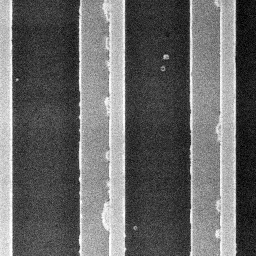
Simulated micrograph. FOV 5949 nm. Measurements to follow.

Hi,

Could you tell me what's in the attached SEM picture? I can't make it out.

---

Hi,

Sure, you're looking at lines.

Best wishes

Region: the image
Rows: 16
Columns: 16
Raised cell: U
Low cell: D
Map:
UDDDDUUUDDDDUUUD
UDDDDUUUDDDDUUUD
UDDDDUUUDDDDUUUD
UDDDDUUUDDDDUUUD
UDDDDUUUDDDDUUUD
UDDDDUUUDDDDUUUD
UDDDDUUUDDDDUUUD
UDDDDUUUDDDDUUUD
UDDDDUUUDDDDUUUD
UDDDDUUUDDDDUUUD
UDDDDUUUDDDDUUUD
UDDDDUUUDDDDUUUD
UDDDDUUUDDDDUUUD
UDDDDUUUDDDDUUUD
UDDDDUUUDDDDUUUD
UDDDDUUUDDDDUUUD